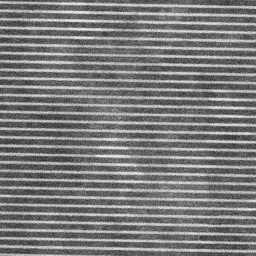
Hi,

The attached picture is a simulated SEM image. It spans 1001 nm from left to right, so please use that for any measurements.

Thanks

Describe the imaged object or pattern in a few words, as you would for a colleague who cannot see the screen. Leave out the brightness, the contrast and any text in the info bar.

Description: parallel lines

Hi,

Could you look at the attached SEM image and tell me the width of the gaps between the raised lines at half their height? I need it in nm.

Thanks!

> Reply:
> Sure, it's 24.9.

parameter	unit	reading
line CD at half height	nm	8.3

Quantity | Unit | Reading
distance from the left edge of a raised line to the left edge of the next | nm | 32.9